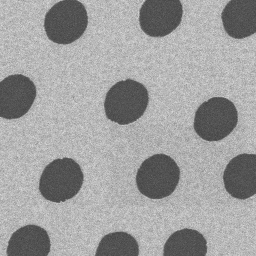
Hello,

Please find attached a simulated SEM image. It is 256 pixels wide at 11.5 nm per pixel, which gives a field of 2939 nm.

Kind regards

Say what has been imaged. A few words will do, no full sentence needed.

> holes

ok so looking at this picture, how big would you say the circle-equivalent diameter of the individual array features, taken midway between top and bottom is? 505 nm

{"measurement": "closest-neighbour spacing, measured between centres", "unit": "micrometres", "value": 0.935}